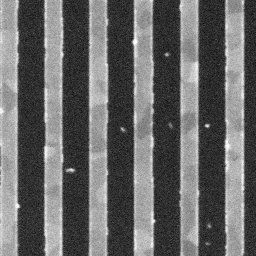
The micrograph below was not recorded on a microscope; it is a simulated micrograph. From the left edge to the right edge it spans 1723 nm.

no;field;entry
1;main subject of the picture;lines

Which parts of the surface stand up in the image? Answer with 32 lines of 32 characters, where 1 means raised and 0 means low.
11000011000110000110000110001100
11000011000110000110000110001100
11000011000110000110000110001100
11000011000110000110000110001100
11000011000110000110000110001100
11000011000110000110000110001100
11000011000110000110000110001100
11000011000110000110000110001100
11000011000110000110000110001100
11000011000110000110000110001100
11000011000110000110000110001100
11000011000110000110000110001100
11000011000110000110000110001100
11000011000110000110000110001100
11000011000110000110000110001100
11000011000110000110000110001100
11000011000110000110000110001100
11000011000110000110000110001100
11000011000110000110000110001100
11000011000110000110000110001100
11000011000110000110000110001100
11000011000110000110000110001100
11000011000110000110000110001100
11000011000110000110000110001100
11000011000110000110000110001100
11000011000110000110000110001100
11000011000110000110000110001100
11000011000110000110000110001100
11000011000110000110000110001100
11000011000110000110000110001100
11000011000110000110000110001100
11000011000110000110000110001100